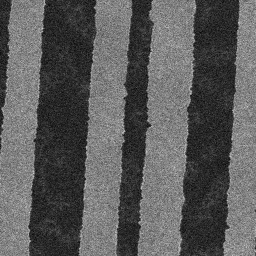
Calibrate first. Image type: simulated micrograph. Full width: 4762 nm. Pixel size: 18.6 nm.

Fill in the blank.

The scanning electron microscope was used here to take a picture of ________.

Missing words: one or a few lines or trenches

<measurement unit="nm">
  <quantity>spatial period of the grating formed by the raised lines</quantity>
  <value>1310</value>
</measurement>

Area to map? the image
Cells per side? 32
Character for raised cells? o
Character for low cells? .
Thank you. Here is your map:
.ooooo......oooo...ooooo......oo
.oooo.......oooo...ooooo......oo
.oooo.......oooo...ooooo......oo
.oooo.......oooo..oooooo......oo
.oooo.......oooo...ooooo......oo
.oooo.......oooo...ooooo......oo
.oooo.......oooo...ooooo......oo
.oooo.......oooo...ooooo......oo
.oooo......ooooo...ooooo......oo
.oooo......ooooo...ooooo......oo
.oooo......ooooo...ooooo.....ooo
.oooo......ooooo..oooooo.....ooo
.oooo......ooooo...ooooo.....ooo
ooooo......ooooo...oooo......ooo
.oooo......oooo....oooo......ooo
ooooo......oooo....oooo......ooo
oooo.......oooo...ooooo......ooo
oooo.......oooo...ooooo......ooo
oooo.......oooo...ooooo......ooo
oooo.......oooo...ooooo......ooo
oooo.......oooo...ooooo......ooo
oooo.......oooo...ooooo......ooo
oooo.......oooo...ooooo......ooo
oooo.......oooo...ooooo......ooo
oooo.......oooo...ooooo.....oooo
oooo.......oooo.o.ooooo.....oooo
oooo......ooooo...ooooo......ooo
oooo......ooooo...ooooo.....oooo
oooo......ooooo...oooo.......ooo
oooo......ooooo..oooooo.....oooo
oooo......ooooo..oooooo.....oooo
oooo......ooooo..ooooo......oooo